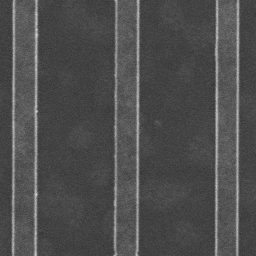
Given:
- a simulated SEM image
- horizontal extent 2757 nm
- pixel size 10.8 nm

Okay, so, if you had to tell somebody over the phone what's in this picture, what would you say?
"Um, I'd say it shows one or a few lines or trenches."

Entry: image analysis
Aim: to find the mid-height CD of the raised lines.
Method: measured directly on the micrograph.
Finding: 0.243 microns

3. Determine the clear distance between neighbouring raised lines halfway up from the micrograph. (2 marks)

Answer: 0.847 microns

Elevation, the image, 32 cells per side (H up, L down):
LLHHHLLLLLLLLLHHHLLLLLLLLLLHHHLL
LLHHHLLLLLLLLLHHHLLLLLLLLLLHHHLL
LLHHHLLLLLLLLLHHHLLLLLLLLLLHHHLL
LLHHHLLLLLLLLLHHHLLLLLLLLLLHHHLL
LLHHHLLLLLLLLLHHHLLLLLLLLLLHHHLL
LLHHHLLLLLLLLLHHHLLLLLLLLLLHHHLL
LLHHHLLLLLLLLLHHHLLLLLLLLLLHHHLL
LLHHHLLLLLLLLLHHHLLLLLLLLLLHHHLL
LLHHHLLLLLLLLLHHHLLLLLLLLLLHHHLL
LLHHHLLLLLLLLLHHHLLLLLLLLLLHHHLL
LLHHHLLLLLLLLLHHHLLLLLLLLLLHHHLL
LLHHHLLLLLLLLLHHHLLLLLLLLLLHHHLL
LLHHLLLLLLLLLLHHHLLLLLLLLLLHHHLL
LLHHLLLLLLLLLLHHHLLLLLLLLLLHHHLL
LLHHLLLLLLLLLLHHHLLLLLLLLLLHHHLL
LLHHLLLLLLLLLLHHHLLLLLLLLLLHHHLL
LLHHLLLLLLLLLLHHHLLLLLLLLLLHHHLL
LLHHLLLLLLLLLLHHHLLLLLLLLLLHHHLL
LLHHLLLLLLLLLLHHHLLLLLLLLLLHHHLL
LLHHLLLLLLLLLLHHHLLLLLLLLLLHHHLL
LLHHLLLLLLLLLLHHHLLLLLLLLLLHHHLL
LLHHLLLLLLLLLLHHHLLLLLLLLLLHHHLL
LLHHLLLLLLLLLLHHHLLLLLLLLLLHHHLL
LLHHLLLLLLLLLLHHHLLLLLLLLLLHHHLL
LLHHLLLLLLLLLLHHHLLLLLLLLLLHHHLL
LLHHLLLLLLLLLLHHHLLLLLLLLLLHHHLL
LLHHLLLLLLLLLLHHHLLLLLLLLLLHHHLL
LLHHLLLLLLLLLLHHHLLLLLLLLLLHHHLL
LLHHLLLLLLLLLLHHHLLLLLLLLLLHHHLL
LLHHLLLLLLLLLLHHHLLLLLLLLLLHHHLL
LLHHLLLLLLLLLLHHHLLLLLLLLLLHHHLL
LLHHLLLLLLLLLLHHHLLLLLLLLLLHHHLL